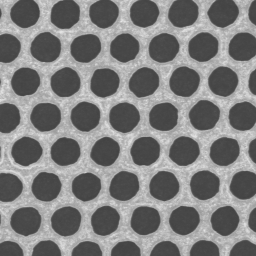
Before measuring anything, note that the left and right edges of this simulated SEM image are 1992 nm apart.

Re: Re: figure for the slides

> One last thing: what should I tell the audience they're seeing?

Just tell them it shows a regular array of holes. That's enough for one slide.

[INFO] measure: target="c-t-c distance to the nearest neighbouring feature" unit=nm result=304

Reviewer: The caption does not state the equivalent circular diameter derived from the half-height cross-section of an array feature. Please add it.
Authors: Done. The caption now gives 0.229 microns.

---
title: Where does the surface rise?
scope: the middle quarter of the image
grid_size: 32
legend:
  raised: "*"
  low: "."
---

********************************
..******....******....******....
...****......****......****.....
....***.......***.......***.....
....***.......**........**......
....***.......**........**......
....***......****......****.....
..******....*****.....******....
********************************
****..**************************
***.....*****....******....*****
**.......***......****.......***
**.......**........**........**.
**.......**........**........**.
**.......**........**.......****
***.....****......****......****
****...******....******....*****
********************************
..*******...*******...******....
...*****.....*****.....****.....
....***.......***.......***.....
....***.......***.......**......
....***.......***.......**......
....***......****.......***.....
...*****.....****......****.....
**********.********..***********
********************************
****...******.....*****....*****
***......***......****......****
**.......***.......**........***
**.......**........**........***
**.......**........**........***